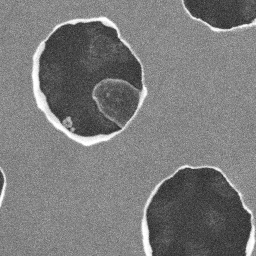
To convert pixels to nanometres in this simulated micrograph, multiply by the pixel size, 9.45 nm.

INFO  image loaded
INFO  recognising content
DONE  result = holes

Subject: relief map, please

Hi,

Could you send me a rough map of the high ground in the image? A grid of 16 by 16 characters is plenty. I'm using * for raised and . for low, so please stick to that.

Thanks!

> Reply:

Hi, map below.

************....
****...******...
***.....********
**......********
**.......*******
**.......*******
***......*******
***.....********
*****..*********
****************
************.***
**********....**
*********......*
*********.......
*********.......
*********......*